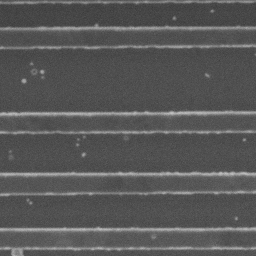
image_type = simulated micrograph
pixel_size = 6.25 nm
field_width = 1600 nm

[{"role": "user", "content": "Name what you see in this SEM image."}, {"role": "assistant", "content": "lines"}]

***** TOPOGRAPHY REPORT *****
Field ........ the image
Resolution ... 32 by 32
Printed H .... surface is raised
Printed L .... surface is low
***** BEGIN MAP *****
LLLLLLLLLLLLLLLLLLLLLLLLLLLLLLLL
LLLLLLLLLLLLLLLLLLLLLLLLLLLLLLLL
LLLLLLLLLLLLLLLLLLLLLLLLLLLLLLLL
LLLLLLLLHHLHLLLLLHHHHHHHHHHHHHHH
HHHHHHHHHHHHHHHHHHHHHHHHHHHHHHHH
HHHHHHHHHHHHHHHHHHHHHHHHHHHHHHHH
LLLLLLLLLLLLLLLLLLLLLLLLLLLLLLLL
LLLLLLLLLLLLLLLLLLLLLLLLLLLLLLLL
LLLLLLLLLLLLLLLLLLLLLLLLLLLLLLLL
LLLLLLLLLLLLLLLLLLLLLLLLLLLLLLLL
LLLLLLLLLLLLLLLLLLLLLLLLLLLLLLLL
LLLLLLLLLLLLLLLLLLLLLLLLLLLLLLLL
LLLLLLLLLLLLLLLLLLLLLLLLLLLLLLLL
LLLLLLLLLLLLLLLLLLLLLLLLLLLLLLLL
HHHHHHHHHHHHHHHHHHHHHHHHHHHHHHHH
HHHHHHHHHHHHHHHHHHHHHHHHHHHHHHHH
HHHHHHHHHHHHHHHHHHHLHLHLHHHHLLLL
LLLLLLLLLLLLLLLLLLLLLLLLLLLLLLLL
LLLLLLLLLLLLLLLLLLLLLLLLLLLLLLLL
LLLLLLLLLLLLLLLLLLLLLLLLLLLLLLLL
LLLLLLLLLLLLLLLLLLLLLLLLLLLLLLLL
LLLLLLLLLLLLLLLLLLLLLLLLLLLLLLLL
HHHHHHHHHHHHHHHHHHHHHHHHHHHHHHHH
HHHHHHHHHHHHHHHHHHHHHHHHHHHHHHHH
LLLLLLLLLLLLLLLLLLLLLLLLLLLLLLLL
LLLLLLLLLLLLLLLLLLLLLLLLLLLLLLLL
LLLLLLLLLLLLLLLLLLLLLLLLLLLLLLLL
LLLLLLLLLLLLLLLLLLLLLLLLLLLLLLLL
LLLLLLLLLLLLLLLLLLLLLLLLLLLLLLLL
HHHHHHHHHHHHHHHHHHHHHHHHHHHHHHHH
HHHHHHHHHHHHHHHHHHHHHHHHHHHHHHHH
LLLLLLLLLLLLLLLLLLLLLLLLLLLLLLLL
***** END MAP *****